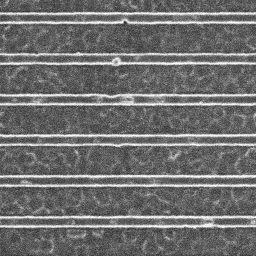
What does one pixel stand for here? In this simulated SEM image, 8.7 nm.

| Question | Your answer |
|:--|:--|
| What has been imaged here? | parallel lines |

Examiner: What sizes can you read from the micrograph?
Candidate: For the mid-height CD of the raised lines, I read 82.6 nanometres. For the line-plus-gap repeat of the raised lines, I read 40.7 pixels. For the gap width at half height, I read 271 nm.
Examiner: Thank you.